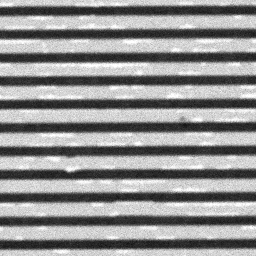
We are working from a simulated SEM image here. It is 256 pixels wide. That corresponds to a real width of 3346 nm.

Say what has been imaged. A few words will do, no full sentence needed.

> parallel lines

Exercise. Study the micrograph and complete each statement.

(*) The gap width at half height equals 123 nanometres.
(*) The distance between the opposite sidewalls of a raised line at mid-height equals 0.185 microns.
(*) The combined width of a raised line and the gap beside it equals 305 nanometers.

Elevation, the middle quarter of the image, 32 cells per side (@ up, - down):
@@@@@@@@@@@@@@@@@@@@@@@@@@@@@@@@
@@@@@@@@@@@@@@@@@@@@@@@@@@@@@@@@
@@@@@@@@@@@@@@@@@@@@@@@@@@@@@@@@
--------------------------------
--------------------------------
@@--@@------------@@@@@@@@@-----
@@@@@@@@@@@@@@@@@@@@@@@@@@@@@@@@
@@@@@@@@@@@@@@@@@@@@@@@@@@@@@@@@
@@@@@@@@@@@@@@@@@@@@@@@@@@@@@@@@
--------------------------------
--------------------------------
@@@@@@@@@@@@@@@@@@@@@@@@@@@@@@@@
@@@@@@@@@@@@@@@@@@@@@@@@@@@@@@@@
@@@@@@@@@@@@@@@@@@@@@@@@@@@@@@@@
@@@@@@@@@@@@@@@@@@@@@@@@@@@@@@@@
--------------------------------
--------------------------------
@@@@@@@@@@@@@@@@@@@@@@@@@@@@@@@@
@@@@@@@@@@@@@@@@@@@@@@@@@@@@@@@@
@@@@@@@@@@@@@@@@@@@@@@@@@@@@@@@@
@@@@@@@@@@@@@-------------------
--------------------------------
--------------------------------
@@@@@@@@@@@@@@@@@@@@@@@@@@@@@@@@
@@@@@@@@@@@@@@@@@@@@@@@@@@@@@@@@
@@@@@@@@@@@@@@@@@@@@@@@@@@@@@@@@
-@@-----------------------------
--------------------------------
--------------------------------
@@@@@@@@@@@@@@@@@@@@@@@@@@@@@@@@
@@@@@@@@@@@@@@@@@@@@@@@@@@@@@@@@
@@@@@@@@@@@@@@@@@@@@@@@@@@@@@@@@